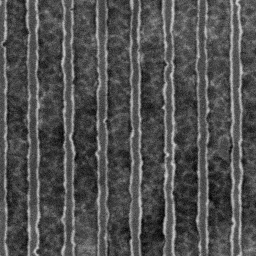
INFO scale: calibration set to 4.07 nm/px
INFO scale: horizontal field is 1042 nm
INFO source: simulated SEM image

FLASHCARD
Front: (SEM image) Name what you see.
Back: parallel lines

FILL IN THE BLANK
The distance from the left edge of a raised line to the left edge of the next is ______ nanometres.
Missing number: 138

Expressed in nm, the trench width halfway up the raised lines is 99.1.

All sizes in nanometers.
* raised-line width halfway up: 37.6